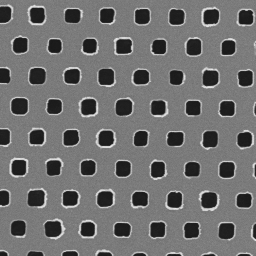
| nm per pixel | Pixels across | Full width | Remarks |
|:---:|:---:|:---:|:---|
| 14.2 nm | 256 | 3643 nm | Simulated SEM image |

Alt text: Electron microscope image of a regular array of holes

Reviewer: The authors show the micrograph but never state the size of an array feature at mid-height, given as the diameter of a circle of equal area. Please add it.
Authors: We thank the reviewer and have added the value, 232 nm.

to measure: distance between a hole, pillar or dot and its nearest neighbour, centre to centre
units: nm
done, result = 489